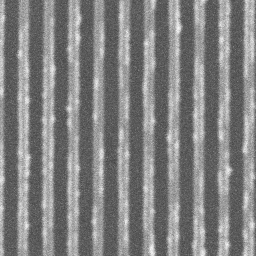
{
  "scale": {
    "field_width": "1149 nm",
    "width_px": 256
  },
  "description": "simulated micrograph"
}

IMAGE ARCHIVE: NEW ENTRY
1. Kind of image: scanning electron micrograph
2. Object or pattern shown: parallel lines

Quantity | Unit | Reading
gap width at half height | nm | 72.4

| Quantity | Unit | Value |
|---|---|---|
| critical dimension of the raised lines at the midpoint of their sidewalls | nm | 40.4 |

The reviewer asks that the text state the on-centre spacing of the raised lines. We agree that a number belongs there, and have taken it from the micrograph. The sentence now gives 113 nm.